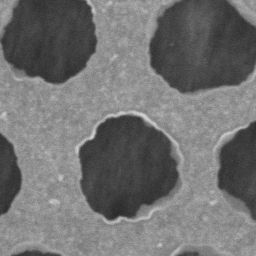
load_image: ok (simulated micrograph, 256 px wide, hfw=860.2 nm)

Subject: holes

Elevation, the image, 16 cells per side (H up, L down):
HLLLLLHHHHLLLLLH
LLLLLLHHHHLLLLLL
LLLLLLHHHLLLLLLL
LLLLLLHHHLLLLLLL
HLLLLHHHHHLLLLLL
HHHHHHHHHHHLLLHH
HHHHHHHHHHHHHHHH
HHHHHHHLLHHHHHHH
HHHHHHLLLLHHHHHL
LHHHHLLLLLLHHHLL
LHHHHLLLLLLHHHLL
LHHHHLLLLLLHHHLL
LHHHHLLLLLHHHHLL
HHHHHHLLLHHHHHHH
HHHHHHHHHHHHHHHH
HHHHHHHHHHHHLHHH